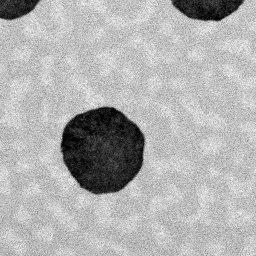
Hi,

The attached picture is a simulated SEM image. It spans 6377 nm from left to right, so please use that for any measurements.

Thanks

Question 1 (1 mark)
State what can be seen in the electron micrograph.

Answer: holes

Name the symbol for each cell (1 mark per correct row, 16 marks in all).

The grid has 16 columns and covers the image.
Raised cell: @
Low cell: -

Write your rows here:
--@@@@@@@@@----@
@@@@@@@@@@@@@@@@
@@@@@@@@@@@@@@@@
@@@@@@@@@@@@@@@@
@@@@@@@@@@@@@@@@
@@@@@@@@@@@@@@@@
@@@@@@@@@@@@@@@@
@@@@----@@@@@@@@
@@@@-----@@@@@@@
@@@@-----@@@@@@@
@@@@-----@@@@@@@
@@@@@---@@@@@@@@
@@@@@@@@@@@@@@@@
@@@@@@@@@@@@@@@@
@@@@@@@@@@@@@@@@
@@@@@@@@@@@@@@@@